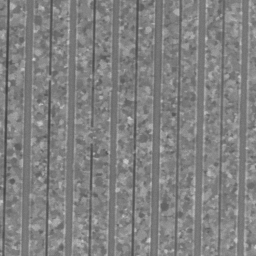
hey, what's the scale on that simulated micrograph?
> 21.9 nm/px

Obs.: parallel lines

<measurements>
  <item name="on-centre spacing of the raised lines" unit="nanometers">471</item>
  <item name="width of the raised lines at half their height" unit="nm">347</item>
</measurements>